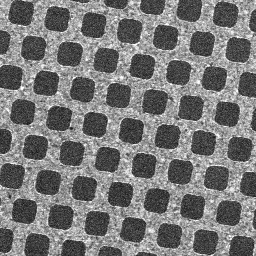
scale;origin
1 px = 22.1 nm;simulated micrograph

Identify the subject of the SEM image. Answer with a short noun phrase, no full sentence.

a regular array of holes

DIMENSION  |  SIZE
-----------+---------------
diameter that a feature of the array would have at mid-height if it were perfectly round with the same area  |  598 nanometers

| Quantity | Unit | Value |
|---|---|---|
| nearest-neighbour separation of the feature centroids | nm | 810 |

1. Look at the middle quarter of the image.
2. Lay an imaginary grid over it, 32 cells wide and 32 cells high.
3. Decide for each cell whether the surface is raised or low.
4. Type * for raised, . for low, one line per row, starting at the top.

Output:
...****......***.......***......
********.....***.......***......
***********.****......***.......
***...************....***.......
**......******************.....*
**......***.....*************.**
*.......***......****...********
*.......***......***......******
**.....***.......***......***...
****..****......***.......***...
***********.....***.......***...
..******************.....****...
..***.....***********....***....
..***......****..************...
..***......***......************
..***......***......****....****
.***.......***......***......***
*****.....****......***......***
********.*****......***......***
....***********....***.......***
.....******************......***
.....***......******************
.....***......****....**********
.....***......***......*********
.....***......***......***......
*...****......***......***......
********.....****......***......
*****************......***......
***.....***********...****......
**......****..************.....*
**......***......***************
**......***.......***.....******